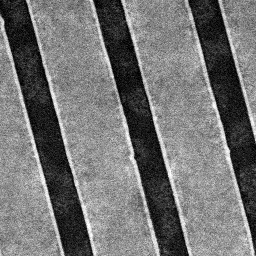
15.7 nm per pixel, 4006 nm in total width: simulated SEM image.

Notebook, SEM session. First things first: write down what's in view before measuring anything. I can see one or a few lines or trenches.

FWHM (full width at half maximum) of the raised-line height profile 0.958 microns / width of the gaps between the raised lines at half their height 495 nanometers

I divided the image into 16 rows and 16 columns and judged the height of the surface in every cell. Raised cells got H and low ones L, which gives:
LLHHHHLLHHHHLLHH
LLHHHHLLHHHHLLHH
LLHHHHLLHHHHLLHH
HLLHHHHLLHHHHLLH
HLLHHHHLLHHHHLLH
HLLHHHHLLHHHHLLH
HLLHHHHLLHHHHLLH
HHLLHHHHLLHHHHLL
HHLLHHHHLLHHHHLL
HHLLHHHHLLHHHHLL
HHHLLHHHHLLHHHLL
HHHLLHHHHLLHHHHL
HHHLLHHHHLLHHHHL
HHHLLHHHHLLHHHHL
HHHHLLHHHHLLHHHH
HHHHLLHHHHLLHHHH